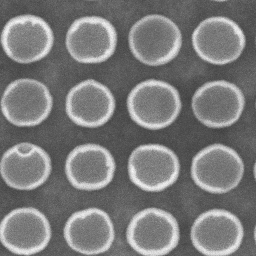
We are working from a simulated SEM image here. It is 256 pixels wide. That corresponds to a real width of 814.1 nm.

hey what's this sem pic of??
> a regular array of raised bodies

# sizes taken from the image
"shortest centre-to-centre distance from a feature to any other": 202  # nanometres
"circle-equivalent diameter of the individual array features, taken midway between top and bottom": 153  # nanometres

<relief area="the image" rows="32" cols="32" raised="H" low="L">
LLLLLLLLLLLLLLLLLLLLLLLLLLLLLLLL
LLLLLLLLLLLLLLLLLLLLLLLLLLLLLLLL
LLHHHLLLLLHHHLLLLLHHHLLLLLHHHLLL
LHHHHHLLLHHHHHLLLHHHHHLLLHHHHHLL
HHHHHHLLLHHHHHLLHHHHHHLLHHHHHHLL
HHHHHHLLHHHHHHLLHHHHHHLLHHHHHHLL
LHHHHHLLLHHHHHLLLHHHHHLLLHHHHHLL
LLHHLLLLLLHHHLLLLLHHHLLLLLHHHLLL
LLLLLLLLLLLLLLLLLLLLLLLLLLLLLLLL
LLLLLLLLLLLLLLLLLLLLLLLLLLLLLLLL
LLHHHLLLLLHHLLLLLLHHHLLLLLHHHLLL
LHHHHHLLLHHHHHLLLHHHHHLLLHHHHHLL
HHHHHHLLHHHHHHLLHHHHHHLLHHHHHHLL
HHHHHHLLHHHHHHLLHHHHHHLLHHHHHHLL
LHHHHHLLLHHHHHLLLHHHHHLLLHHHHHLL
LLHHLLLLLLHHHLLLLLHHHLLLLLHHHLLL
LLLLLLLLLLLLLLLLLLLLLLLLLLLLLLLL
LLLLLLLLLLLLLLLLLLLLLLLLLLLLLLLL
LLLLHLLLLLHHHLLLLHHHHLLLLLHHLLLL
LHHHHHLLLHHHHHLLHHHHHHLLLHHHHHLL
HHHHHHLLHHHHHHLLHHHHHHLLHHHHHHLL
HHHHHHLLHHHHHHLLHHHHHHLLHHHHHHLL
LHHHHHLLLHHHHHLLLHHHHHLLHHHHHHLL
LLHHLLLLLLHHLLLLLLHHLLLLLHHHHLLL
LLLLLLLLLLLLLLLLLLLLLLLLLLLLLLLL
LLLLLLLLLLLLLLLLLLLLLLLLLLLLLLLL
LLHHHLLLLLHHHLLLLLHHLLLLLLHHLLLL
LHHHHHLLLHHHHHLLLHHHHHLLLHHHHHLL
HHHHHHLLHHHHHHLLHHHHHHLLHHHHHHLL
HHHHHHLLHHHHHHLLHHHHHHLLHHHHHHLL
LHHHHHLLLHHHHHLLHHHHHHLLHHHHHHLL
LLHHLLLLLLHHLLLLLLHHHLLLLHHHHLLL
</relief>